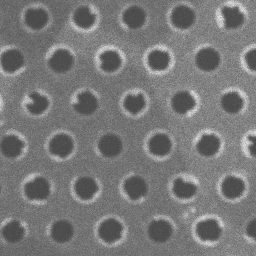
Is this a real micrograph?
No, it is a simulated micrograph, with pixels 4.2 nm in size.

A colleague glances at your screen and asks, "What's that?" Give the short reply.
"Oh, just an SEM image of a regular array of holes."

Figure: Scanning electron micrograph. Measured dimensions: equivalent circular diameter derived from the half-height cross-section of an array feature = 96.4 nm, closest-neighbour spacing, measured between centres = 48.3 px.